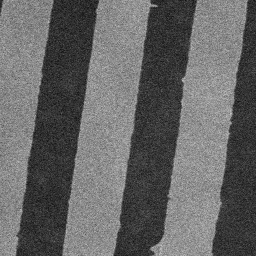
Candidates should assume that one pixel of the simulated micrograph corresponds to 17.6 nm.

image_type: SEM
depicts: one or a few lines or trenches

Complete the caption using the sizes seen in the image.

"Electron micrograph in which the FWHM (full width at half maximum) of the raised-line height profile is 889 nm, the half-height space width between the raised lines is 815 nanometers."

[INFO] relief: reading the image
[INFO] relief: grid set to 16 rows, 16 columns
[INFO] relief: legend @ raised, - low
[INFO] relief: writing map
@@@---@@@---@@@-
@@@---@@@---@@@-
@@@---@@@---@@@-
@@@---@@@---@@@-
@@@---@@@---@@@-
@@---@@@@--@@@@-
@@---@@@---@@@@-
@@---@@@---@@@--
@@---@@@---@@@--
@@---@@@---@@@--
@@---@@@---@@@--
@@---@@@---@@@--
@---@@@@---@@@--
@---@@@---@@@@--
@---@@@---@@@---
@---@@@---@@@---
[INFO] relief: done